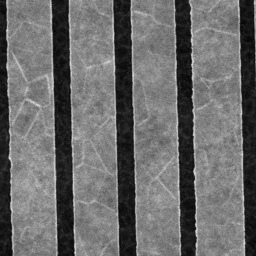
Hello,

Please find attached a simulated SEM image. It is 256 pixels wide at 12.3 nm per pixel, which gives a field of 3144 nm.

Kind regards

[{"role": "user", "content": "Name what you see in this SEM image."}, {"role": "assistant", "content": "one or a few lines or trenches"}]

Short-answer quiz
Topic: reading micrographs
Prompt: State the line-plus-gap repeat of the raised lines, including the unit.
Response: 0.761 micrometres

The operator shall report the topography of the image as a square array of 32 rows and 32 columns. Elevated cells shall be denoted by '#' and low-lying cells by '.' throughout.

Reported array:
.#####...#####..######..######..
.#####...#####..######..######..
.#####...#####..######..######..
.#####...#####...#####..######..
.#####...#####...#####..######..
.#####...#####...#####..######..
.#####...#####...#####..######..
.#####...#####...#####..######..
.######..#####...#####..######..
.######..#####...#####..######..
.######..#####...#####..######..
.######..#####...#####..######..
.######..#####...#####..######..
.######..#####...#####..######..
.######..#####...#####..######..
.######..#####...#####..######..
.######..######..#####..######..
.######..######..#####..######..
.######..######..#####..######..
.######..######..#####..######..
.######..######..#####..######..
.######..######..#####..######..
.######..######..#####..######..
.######..######..#####..######..
.######..######..#####..######..
.######..######..#####...#####..
.######..######..#####...#####..
.######..######..#####...#####..
..#####..######..#####...######.
..#####..######..#####...######.
..#####..######..######..######.
..#####..######..######..######.